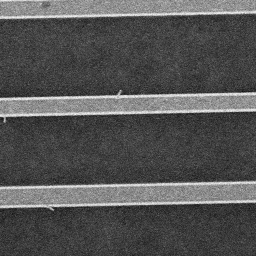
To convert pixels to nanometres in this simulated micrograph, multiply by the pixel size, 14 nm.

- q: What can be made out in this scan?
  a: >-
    one or a few lines or trenches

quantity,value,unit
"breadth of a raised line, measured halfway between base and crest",250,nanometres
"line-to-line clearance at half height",1070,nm